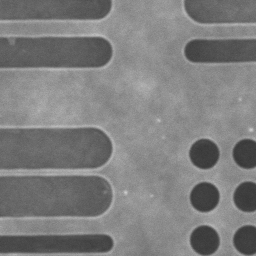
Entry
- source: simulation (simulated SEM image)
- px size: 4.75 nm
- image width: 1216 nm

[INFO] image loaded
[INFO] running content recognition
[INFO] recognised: groups of lines, slits or small figures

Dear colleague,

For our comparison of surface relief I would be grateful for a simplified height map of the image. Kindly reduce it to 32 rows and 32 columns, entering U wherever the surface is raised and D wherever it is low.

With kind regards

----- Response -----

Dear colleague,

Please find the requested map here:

DDDDDDDDDDDDDDUUUUUUUUUDDDDDDDDD
DDDDDDDDDDDDDDUUUUUUUUUDDDDDDDDD
DDDDDDDDDDDDUUUUUUUUUUUUDDDDDDDD
UUUUUUUUUUUUUUUUUUUUUUUUUUUUUUUU
UUUUUUUUUUUUUUUUUUUUUUUUUUUUUUUU
DDDDDDDDDDDDDDUUUUUUUUUDDDDDDDDD
DDDDDDDDDDDDDDUUUUUUUUUDDDDDDDDD
DDDDDDDDDDDDDDUUUUUUUUUDDDDDDDDD
DDDDDDDDDDDDUUUUUUUUUUUUUUUUUUUU
UUUUUUUUUUUUUUUUUUUUUUUUUUUUUUUU
UUUUUUUUUUUUUUUUUUUUUUUUUUUUUUUU
UUUUUUUUUUUUUUUUUUUUUUUUUUUUUUUU
UUUUUUUUUUUUUUUUUUUUUUUUUUUUUUUU
UUUUUUUUUUUUUUUUUUUUUUUUUUUUUUUU
UUUUUUUUUUUUUUUUUUUUUUUUUUUUUUUU
UUUUUUUUUUUUUUUUUUUUUUUUUUUUUUUU
DDDDDDDDDDDDDUUUUUUUUUUUUUUUUUUU
DDDDDDDDDDDDDDUUUUUUUUUUUDUUUUDD
DDDDDDDDDDDDDDUUUUUUUUUUDDDUUDDD
DDDDDDDDDDDDDDUUUUUUUUUUDDDUUDDD
DDDDDDDDDDDDDUUUUUUUUUUUDDDUUUDD
UUUUUUUUUUUUUUUUUUUUUUUUUUUUUUUU
DDDDDDDDDDDDDUUUUUUUUUUUUUUUUUUU
DDDDDDDDDDDDDDUUUUUUUUUUDDDUUUDD
DDDDDDDDDDDDDDUUUUUUUUUUDDDUUDDD
DDDDDDDDDDDDDDUUUUUUUUUUDDDUUDDD
DDDDDDDDDDDDDUUUUUUUUUUUUDUUUUDD
UUUUUUUUUUUUUUUUUUUUUUUUUUUUUUUU
UUUUUUUUUUUUUUUUUUUUUUUUUDUUUUDD
DDDDDDDDDDDDDDUUUUUUUUUUDDDUUDDD
DDDDDDDDDDDDDDUUUUUUUUUUDDDUUDDD
DDDDDDDDDDDDDUUUUUUUUUUUDDDUUUDD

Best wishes